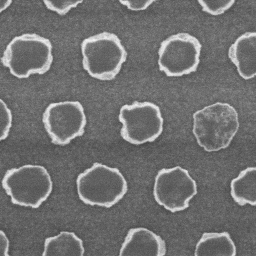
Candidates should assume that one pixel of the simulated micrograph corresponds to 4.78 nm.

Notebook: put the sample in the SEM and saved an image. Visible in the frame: a regular array of raised bodies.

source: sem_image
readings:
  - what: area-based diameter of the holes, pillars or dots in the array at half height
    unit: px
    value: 41.5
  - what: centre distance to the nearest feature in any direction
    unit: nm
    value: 353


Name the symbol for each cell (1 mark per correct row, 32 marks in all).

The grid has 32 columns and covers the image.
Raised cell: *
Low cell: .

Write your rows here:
*.....****......***......****...
..........................**....
................................
................................
...............................*
.*****.....****......****....***
.*****....*****.....*****....***
.*****.....****.....*****....***
.*****.....****.....****......**
..*.........*.................**
................................
................................
................................
*.....****.....****.............
*.....****.....*****............
*.....****.....*****............
*.....****......****............
.......**.......***.............
................................
................................
................................
..****.....****.....***........*
.*****....******...*****.....***
.*****....******...******....***
.*****....*****....*****.....***
...**.......**......***.........
................................
................................
................................
*......**.......***.......**....
*.....****......****.....****...
*.....****.....*****....*****...